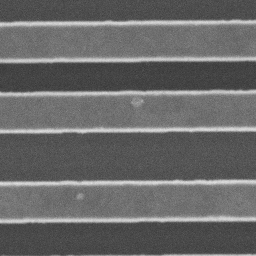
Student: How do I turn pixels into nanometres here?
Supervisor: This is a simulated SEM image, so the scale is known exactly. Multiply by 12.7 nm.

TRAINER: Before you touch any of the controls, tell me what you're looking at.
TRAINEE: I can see lines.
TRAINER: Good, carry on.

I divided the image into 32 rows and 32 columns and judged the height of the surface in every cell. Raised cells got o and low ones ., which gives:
................................
................................
................................
oooooooooooooooooooooooooooooooo
oooooooooooooooooooooooooooooooo
oooooooooooooooooooooooooooooooo
oooooooooooooooooooooooooooooooo
oooooooooooooooooooooooooooooo..
................................
................................
................................
...............oo.oooooooooooooo
oooooooooooooooooooooooooooooooo
oooooooooooooooooooooooooooooooo
oooooooooooooooooooooooooooooooo
oooooooooooooooooooooooooooooooo
ooooo...........................
................................
................................
................................
................................
................................
................................
oooooooooooooooooooooooooooooooo
oooooooooooooooooooooooooooooooo
oooooooooooooooooooooooooooooooo
oooooooooooooooooooooooooooooooo
oooooooooooooooooooooooooooooooo
................................
................................
................................
................................